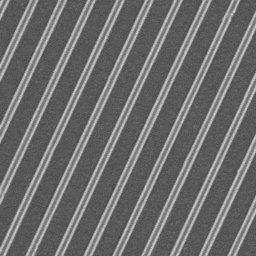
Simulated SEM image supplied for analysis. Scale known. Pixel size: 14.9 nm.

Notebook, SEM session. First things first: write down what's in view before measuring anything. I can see parallel lines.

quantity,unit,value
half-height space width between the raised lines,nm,300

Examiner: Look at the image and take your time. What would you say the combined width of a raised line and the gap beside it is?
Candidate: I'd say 389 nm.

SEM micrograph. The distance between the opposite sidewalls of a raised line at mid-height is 91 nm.